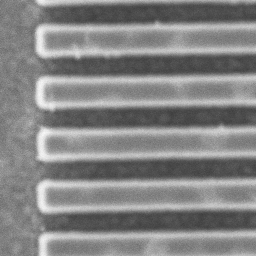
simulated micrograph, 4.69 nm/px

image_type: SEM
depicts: parallel lines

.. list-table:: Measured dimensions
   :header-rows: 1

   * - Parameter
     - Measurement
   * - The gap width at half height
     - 106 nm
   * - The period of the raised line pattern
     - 244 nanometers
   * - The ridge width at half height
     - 141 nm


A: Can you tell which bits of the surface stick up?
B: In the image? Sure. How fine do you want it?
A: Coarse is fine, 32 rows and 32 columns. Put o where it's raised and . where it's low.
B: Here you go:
................................
................................
................................
.....ooooooooooooooooooooooooooo
.....ooooooooooooooooooooooooooo
.....ooooooooooooooooooooooooooo
.....ooooooooooooooooooooooooooo
................................
................................
........................oooooooo
.....ooooooooooooooooooooooooooo
.....ooooooooooooooooooooooooooo
.....ooooooooooooooooooooooooooo
......o.........................
................................
................................
.....ooooooooooooooooooooooooooo
.....ooooooooooooooooooooooooooo
.....ooooooooooooooooooooooooooo
.....ooooooooooooooooooooooooo.o
................................
................................
.........................ooooooo
.....ooooooooooooooooooooooooooo
.....ooooooooooooooooooooooooooo
.....ooooooooooooooooooooooooooo
................................
................................
................................
......oooooooooooooooooooooooooo
.....ooooooooooooooooooooooooooo
.....ooooooooooooooooooooooooooo